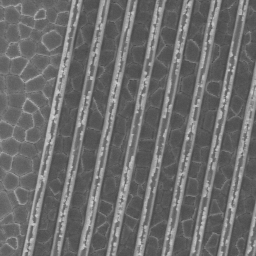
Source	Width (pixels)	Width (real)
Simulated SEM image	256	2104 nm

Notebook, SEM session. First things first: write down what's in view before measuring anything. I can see parallel lines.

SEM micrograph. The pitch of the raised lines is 224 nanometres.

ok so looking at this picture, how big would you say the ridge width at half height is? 0.0645 µm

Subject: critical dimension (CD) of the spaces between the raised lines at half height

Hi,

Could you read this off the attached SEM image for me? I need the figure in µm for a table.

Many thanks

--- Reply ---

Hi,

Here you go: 0.157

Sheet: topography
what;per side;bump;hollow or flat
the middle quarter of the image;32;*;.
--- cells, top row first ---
*.....**.....**.....**.....**...
*.....**.....**.....**.....**...
*.....**.....**.....**.....**...
.....***.....*.....**.....**....
.....**.....**.....**.....**....
.....**.....**.....**.....**....
.....**.....**.....**.....**....
.....**.....**.....**.....**....
....***....**.....**.....**.....
....**.....**.....**.....**.....
....**.....**.....**.....**.....
....**.....**.....**.....**.....
....**.....**.....**.....**.....
...***.....*.....**.....**.....*
...**.....**.....**.....**.....*
...**.....**.....**.....**.....*
...**.....**.....**.....**.....*
...**.....**.....**.....**.....*
...**.....**....***....**.....**
..**.....**.....**.....**.....**
..**.....**.....**.....**.....**
..**.....**.....**.....**.....**
..**.....**.....**.....**.....**
..**.....**.....*.....**.....**.
.**.....**.....**.....**.....**.
.**.....**.....**.....**.....**.
.**.....**.....**.....**.....**.
.**.....**.....**.....**.....**.
.**.....**.....*.....***.....*..
.*.....**.....**.....**.....**..
**.....**.....**.....**.....**..
**.....**.....**.....**.....**..